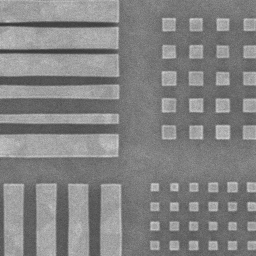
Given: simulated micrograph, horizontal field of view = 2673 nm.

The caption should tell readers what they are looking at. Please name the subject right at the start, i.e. groups of lines, slits or small figures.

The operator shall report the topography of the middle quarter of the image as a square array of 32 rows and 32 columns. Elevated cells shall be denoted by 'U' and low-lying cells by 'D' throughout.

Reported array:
UUUUUUUUUUUUUDDDDDDDDDDDDDDDDDDD
UUUUUUUUUUUUUDDDDDDDDDDDDDDDDDDD
UUUUUUUUUUUUUDDDDDDDDDDDDUUUDDDU
DDDDDDDDDDDDDDDDDDDDDDDDDUUUDDDU
DDDDDDDDDDDDDDDDDDDDDDDDDUUUDDDU
DDDDDDUUUUUUUDDDDDDDDDDDDDDDDDDD
UUUUUUUUUUUUUUDDDDDDDDDDDDDDDDDD
UUUUUUUUUUUUUUDDDDDDDDDDDDDDDDDD
DDDDDDDDDDDDDDDDDDDDDDDDDDDDDDDD
DDDDDDDDDDDDDDDDDDDDDDDDDUUUDDDD
DDDDDDDDDDDDDDDDDDDDDDDDDUUUDDDD
DDDDDDDDDDDDDDDDDDDDDDDDDUUUDDDD
DDDDDDDDDDDDDDDDDDDDDDDDDDDDDDDD
UUUUUUUUUUUUUDDDDDDDDDDDDDDDDDDD
UUUUUUUUUUUUUDDDDDDDDDDDDDDDDDDD
DDDDDDDDDDDDDDDDDDDDDDDDDDDDDDDD
DDDDDDDDDDDDDDDDDDDDDDDDDUUUDDDD
DDDDDDDDDDDDDDDDDDDDDDDDDUUUDDDD
UUUUUUUUUUUUUDDDDDDDDDDDDUUUDDDD
UUUUUUUUUUUUUDDDDDDDDDDDDDDDDDDD
UUUUUUUUUUUUUDDDDDDDDDDDDDDDDDDD
UUUUUUUUUUUUUDDDDDDDDDDDDDDDDDDD
UUUUUUUUUUUUUDDDDDDDDDDDDDDDDDDD
DDDDDDDDDDDDDDDDDDDDDDDDDDDDDDDD
DDDDDDDDDDDDDDDDDDDDDDDDDDDDDDDD
DDDDDDDDDDDDDDDDDDDDDDDDDDDDDDDD
DDDDDDDDDDDDDDDDDDDDDDDDDDDDDDDD
DDDDDDDDDDDDDDDDDDDDDDDDDDDDDDDD
DDDDDDDDDDDDDDDDDDDDDDDDDDDDDDDD
DDDDDDDDDDDDDDDDDDDDDDDDDDDDDDDD
DUUUUUDDDUUUUUDDDDDDDDUDDDDUDDDD
DUUUUUDDDUUUUUDDDDDDDDDDDDDDDDDD